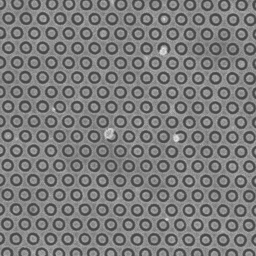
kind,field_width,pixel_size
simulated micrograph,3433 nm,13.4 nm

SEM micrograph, a regular array of ring-shaped grooves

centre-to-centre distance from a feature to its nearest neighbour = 0.223 micrometres